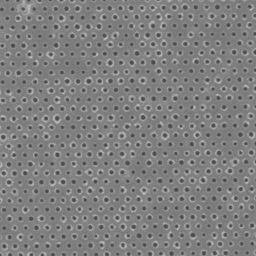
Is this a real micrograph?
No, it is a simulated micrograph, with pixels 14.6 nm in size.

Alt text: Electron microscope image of a regular array of holes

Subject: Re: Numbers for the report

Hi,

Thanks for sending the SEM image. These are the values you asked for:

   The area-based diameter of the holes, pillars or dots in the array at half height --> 0.0638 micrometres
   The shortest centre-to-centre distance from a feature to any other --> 151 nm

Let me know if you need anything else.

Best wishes